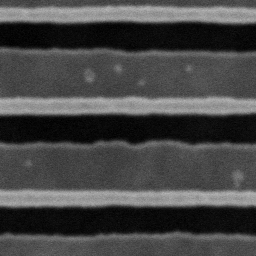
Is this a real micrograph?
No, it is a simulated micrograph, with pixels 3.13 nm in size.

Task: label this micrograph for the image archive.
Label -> lines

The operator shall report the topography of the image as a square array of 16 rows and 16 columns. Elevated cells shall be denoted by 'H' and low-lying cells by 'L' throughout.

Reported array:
HHHHHHHHHHHHHHHH
LLLLLLLLLLLLLLLL
LLLLLLLLLLLLLLLL
HHHHHHHHHHHHHHHH
HHHHHHHHHHHHHHHH
HHHHHHHHHHHHHHHH
HHHHHHHHHHHHHHHH
LLLLLLLLLLLLLLLL
LLLLLLLLLLLLLLLL
HHHHHHHHHHHHHHHH
HHHHHHHHHHHHHHHH
HHHHHHHHHHHHHHHH
HHHHHHHHHHHHHHHH
LLLLLLLLLLLLLLLL
LLLLLLLLLLLLLLLL
HHHHHHHHHHHHHHHH